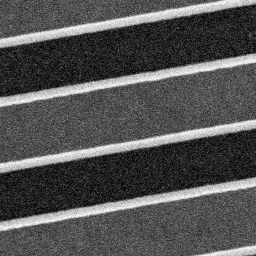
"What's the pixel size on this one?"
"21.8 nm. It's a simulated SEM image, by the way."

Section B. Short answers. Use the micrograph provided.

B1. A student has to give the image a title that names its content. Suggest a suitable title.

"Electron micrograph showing one or a few lines or trenches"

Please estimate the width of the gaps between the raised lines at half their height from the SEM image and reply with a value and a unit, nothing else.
1270 nanometers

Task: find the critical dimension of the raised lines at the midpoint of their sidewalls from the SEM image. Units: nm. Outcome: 1390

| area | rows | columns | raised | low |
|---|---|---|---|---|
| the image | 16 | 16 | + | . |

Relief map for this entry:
+++++++++++++...
+++++++.........
+...............
................
...........+++++
.....+++++++++++
++++++++++++++++
++++++++++++++++
+++++++++++.....
++++++..........
................
...............+
..........++++++
....++++++++++++
++++++++++++++++
++++++++++++++++